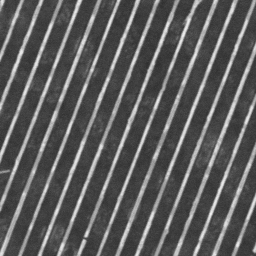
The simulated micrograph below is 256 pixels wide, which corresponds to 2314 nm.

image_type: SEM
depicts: parallel lines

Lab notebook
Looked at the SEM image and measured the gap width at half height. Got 134 nm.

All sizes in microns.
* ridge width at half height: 0.0253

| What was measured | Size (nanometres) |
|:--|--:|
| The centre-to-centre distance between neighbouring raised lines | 164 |